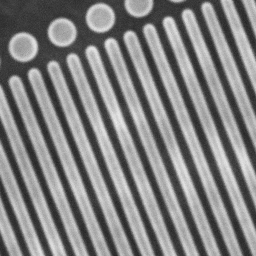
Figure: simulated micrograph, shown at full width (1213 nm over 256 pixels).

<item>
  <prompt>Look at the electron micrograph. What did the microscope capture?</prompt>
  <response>groups of lines, slits or small figures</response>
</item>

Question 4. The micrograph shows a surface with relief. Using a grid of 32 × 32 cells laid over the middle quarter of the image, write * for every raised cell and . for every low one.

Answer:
.***...***..***...***..***...***
..***..***...***..***...***..***
..***...**...***...***..***...**
..***...***...**...***..****..**
...***..***...***...**...***..**
*..***...***..***...***..***...*
*..****..***...**...***...***..*
*...***..***...***...**...***..*
**..****..***..***...***...**...
**...***..***...***..***...***..
***..***...***..***...**...***..
***..***...***...**...***...**..
***...***...**...***...**...***.
.***..***...**...***...***..***.
.***...**....**...***..***...***
.****..***...**...***...***..***
..***...**...***...***..***...**
..***...***...**...***..***...**
...***..***...***..***...***..**
*..***...**...***...***..***...*
*..***...***...**...***...**...*
*...***..***...***..***...***...
**..***...***..***...***...**...
**...***..***...***..***...**...
***..***..****..***...**...***..
***..***...***..****..***...**..
***...***..***...***..***...**..
.***..***...***..***...***...**.
.***...**...***..****..***...**.
.***...***...**...***..***...***
..***..***...***..****..***...**
..***...***..***...***..***...**